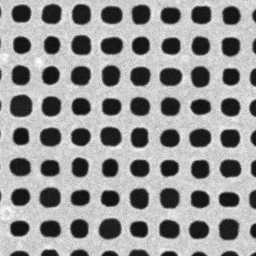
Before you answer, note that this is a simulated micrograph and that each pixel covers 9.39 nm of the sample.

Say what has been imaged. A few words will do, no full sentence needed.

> a regular array of holes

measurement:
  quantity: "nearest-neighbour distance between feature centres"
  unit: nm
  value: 278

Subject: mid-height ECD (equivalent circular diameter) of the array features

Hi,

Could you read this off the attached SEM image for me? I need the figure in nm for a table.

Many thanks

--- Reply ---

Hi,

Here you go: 189